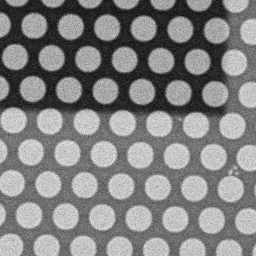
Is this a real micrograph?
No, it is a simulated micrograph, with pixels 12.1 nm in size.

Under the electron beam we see an array of small figures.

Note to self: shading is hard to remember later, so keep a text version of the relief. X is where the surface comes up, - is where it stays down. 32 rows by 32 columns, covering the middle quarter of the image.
---XXXXXX---XXXXXX---XXXXXX---XX
-----XX------XXXX-----XXXX-----X
--------------------------------
-X------------------------------
XXXX----XXXXX-----XXX------XXX--
XXXX----XXXXX----XXXXX----XXXXX-
XXXX---XXXXXX---XXXXXXX---XXXXXX
XXXX---XXXXXX---XXXXXXX---XXXXXX
XXXX----XXXXX----XXXXX----XXXXX-
-X-------XXX------XXX------XXXX-
--------------------------------
-----X--------------------------
---XXXXX-----XXXX-----XXXX------
---XXXXXX---XXXXX----XXXXX----XX
---XXXXXX---XXXXXX---XXXXXX---XX
---XXXXXX---XXXXXX---XXXXXX---XX
---XXXXX----XXXXX----XXXXXX---XX
-------------XXX------XXXX-----X
--------------------------------
XX------------------------------
XXX-----XXXX-----XXXX-----XXXX--
XXXX---XXXXXX---XXXXXX---XXXXXX-
XXXX---XXXXXX---XXXXXX---XXXXXX-
XXXX---XXXXXX---XXXXXX---XXXXXX-
XXX----XXXXX----XXXXXX---XXXXXX-
---------XX------XXXX-----XXXX--
--------------------------------
----XX--------------------------
---XXXXX----XXXXX----XXXX------X
--XXXXXX---XXXXXX----XXXXX----XX
--XXXXXX---XXXXXX---XXXXXX----XX
--XXXXXX---XXXXXX---XXXXXX----XX